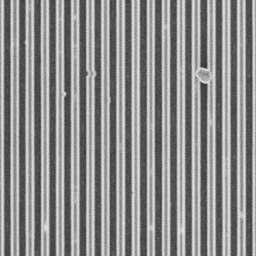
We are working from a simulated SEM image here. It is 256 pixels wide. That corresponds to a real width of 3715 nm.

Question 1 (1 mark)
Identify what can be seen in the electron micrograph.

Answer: parallel lines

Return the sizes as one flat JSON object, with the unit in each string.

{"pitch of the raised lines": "220 nm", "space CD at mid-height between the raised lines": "125 nanometers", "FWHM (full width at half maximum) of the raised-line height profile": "99.7 nanometres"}